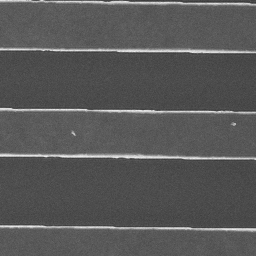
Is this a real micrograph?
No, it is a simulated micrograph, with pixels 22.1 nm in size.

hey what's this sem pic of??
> lines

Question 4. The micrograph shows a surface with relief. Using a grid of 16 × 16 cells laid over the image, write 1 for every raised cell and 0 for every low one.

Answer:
1111111111111111
1111111111111111
1111111111111111
0000000000000000
0000000000000000
0000000000000000
0000000000000000
1111111111111111
1111111111111111
1111111111111111
0000000000000000
0000000000000000
0000000000000000
0000000000000000
1111111111111111
1111111111111111